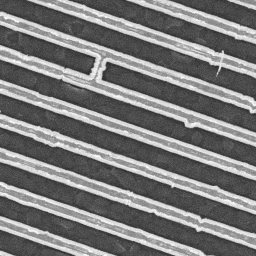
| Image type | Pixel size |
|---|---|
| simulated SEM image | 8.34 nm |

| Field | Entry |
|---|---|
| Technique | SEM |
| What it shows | parallel lines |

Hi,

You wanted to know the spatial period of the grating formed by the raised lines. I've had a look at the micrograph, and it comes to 269 nm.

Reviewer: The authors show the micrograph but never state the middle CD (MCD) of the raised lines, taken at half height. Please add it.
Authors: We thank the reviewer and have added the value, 81.8 nanometers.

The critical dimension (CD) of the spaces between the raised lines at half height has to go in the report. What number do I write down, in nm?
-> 185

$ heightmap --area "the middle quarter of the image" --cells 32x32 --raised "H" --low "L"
LLLLLLLLHHLLLLLHHHHHHHLLLLLLLLLL
LLLLLLLHHHLLLLLLLLLHHHHHHLLLLLLL
HHHLLLLHHLLLLLLLLLLLLHHHHHHHLLLL
HHHHHHHHHLLLLLLLLLLLLLLLHHHHHHHL
LLHHHHHHHLLLLLLLLLLLLLLLLLLHHHHH
LLLLLHHHHHHHLLLLLLLLLLLLLLLLLLHH
LLLLLLLLHHHHHHHLLLLLLLLLLLLLLLLL
LLLLLLLLLLLHHHHHHHLLLLLLLLLLLLLL
LLLLLLLLLLLLLHHHHHHHHHLLLLLLLLLL
LLLLLLLLLLLLLLLLLHHHHHHHLLLLLLLL
HHLLLLLLLLLLLLLLLLLLHHHHHHHLLLLL
HHHHHLLLLLLLLLLLLLLLLLLHHHHHHHLL
LHHHHHHHLLLLLLLLLLLLLLLLLLHHHHHH
LLLLHHHHHHHLLLLLLLLLLLLLLLLLLHHH
LLLLLLLHHHHHHHLLLLLLLLLLLLLLLLHH
LLLLLLLLLHHHHHHHHLLLLLLLLLLLLLLL
LLLLLLLLLLLLHHHHHHHHLLLLLLLLLLLL
LLLLLLLLLLLLLLLLHHHHHHHLLLLLLLLL
LLLLLLLLLLLLLLLLLLHHHHHHHLLLLLLL
HHHLLLLLLLLLLLLLLLLLLHHHHHHHHLLL
HHHHHHLLLLLLLLLLLLLLLLLLHHHHHHHL
LLHHHHHHHLLLLLLLLLLLLLLLLLLHHHHH
LLLLLLHHHHHHLLLLLLLLLLLLLLLLLLHH
LLLLLLLLHHHHHHHLLLLLLLLLLLLLLLLL
LLLLLLLLLLLHHHHHHHLLLLLLLLLLLLLL
LLLLLLLLLLLLLLHHHHHHHLLLLLLLLLLL
LLLLLLLLLLLLLLLLLHHHHHHLLLLLLLLL
HHLLLLLLLLLLLLLLLLLLHHHHHHLLLLLL
HHHHHLLLLLLLLLLLLLLLLLLHHHHHHLLL
LHHHHHHLLLLLLLLLLLLLLLLLLLHHHHHH
LLLHHHHHHHHLLLLLLLLLLLLLLLLLHHHH
LLLLLLHHHHHHHHLLLLLLLLLLLLLLLLLH